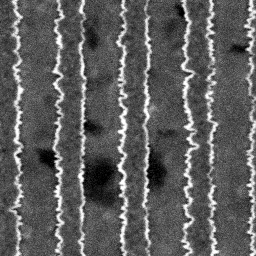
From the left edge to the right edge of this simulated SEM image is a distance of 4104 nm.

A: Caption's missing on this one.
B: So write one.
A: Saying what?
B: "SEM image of one or a few lines or trenches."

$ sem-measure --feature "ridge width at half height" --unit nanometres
400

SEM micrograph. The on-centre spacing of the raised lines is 1030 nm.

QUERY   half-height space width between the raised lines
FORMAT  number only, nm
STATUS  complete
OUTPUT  627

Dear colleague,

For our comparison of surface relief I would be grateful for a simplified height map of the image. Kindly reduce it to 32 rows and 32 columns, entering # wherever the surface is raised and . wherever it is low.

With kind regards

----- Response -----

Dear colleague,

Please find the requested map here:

##.....###.....###.....####....#
##.....###.....###.....####....#
##.....###.....####....###.....#
##.....###......##.....###.....#
##.....###.....###.....###.....#
##.....###.....####....###.....#
##.....###.....####....###.....#
###....###.....####....####....#
##.....###.....####....###.....#
##.....###.....###......##.....#
##.....####....###.....###.....#
###....####....###.....###.....#
##.....###.....####....###......
##.....###.....####....###......
##......##.....####.....##.....#
##.....###.....###......###.....
##.....###.....###......###....#
##.....####....###......##.....#
###....###.....####.....###....#
##.....###.....###.....####....#
##.....###.....###.....###.....#
###....###.....###.....###......
##.....###.....###......##.....#
###....###.....###.....####....#
###....###.....###.....###.....#
##.....###......##.....####.....
##.....###.....###.....####....#
##.....###.....###......##.....#
##.....###.....###.....####....#
####...###.....###.....####....#
##.....###.....####....####.....
##.....###.....####.....###.....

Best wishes